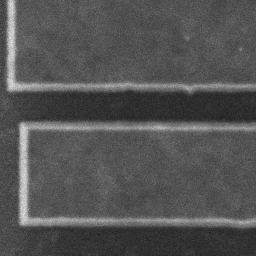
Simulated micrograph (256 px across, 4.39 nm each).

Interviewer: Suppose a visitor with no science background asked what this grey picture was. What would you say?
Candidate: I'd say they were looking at one or a few lines or trenches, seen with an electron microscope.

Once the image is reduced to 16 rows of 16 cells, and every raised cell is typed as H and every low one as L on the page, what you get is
LHHHHHHHHHHHHHHH
LHHHHHHHHHHHHHHH
LHHHHHHHHHHHHHHH
LHHHHHHHHHHHHHHH
LHHHHHHHHHHHHHHH
LLLLLLHLLLLHHLHH
LLLLLLLLLLLLLLLL
LLLLLLLLLLLLLLLL
LLHHHHHHHHHHHHHH
LLHHHHHHHHHHHHHH
LLHHHHHHHHHHHHHH
LLHHHHHHHHHHHHHH
LLHHHHHHHHHHHHHH
LLHHHHHHHHHHHHHH
LLLLLLLLLLLLLLLL
LLLLLLLLLLLLLLLL